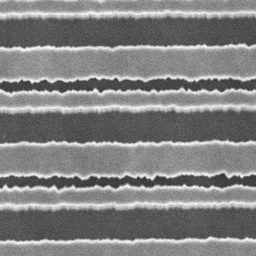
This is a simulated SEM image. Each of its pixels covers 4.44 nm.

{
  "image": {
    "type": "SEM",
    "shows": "lines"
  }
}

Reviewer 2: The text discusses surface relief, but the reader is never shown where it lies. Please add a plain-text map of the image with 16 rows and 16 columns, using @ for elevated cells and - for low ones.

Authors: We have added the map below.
@@@@@@@@@@@@@@@@
----------------
----------------
@@@@@@@@@@@@@@@@
@@@@@@@@@@@@@@@@
@@@@@@@@@@@@@@@@
@@@@@@@@@@@@@@@@
----------------
----------------
@@@@@@@@@@@@@@@@
@@@@@@@@@@@@@@@@
@@@@@@@@@@@@@@@@
@@@@@@@@@@@@@@@@
----------------
----------------
@@@@@@@@@@@@@@@@